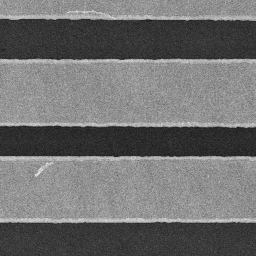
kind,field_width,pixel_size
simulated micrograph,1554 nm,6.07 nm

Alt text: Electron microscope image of lines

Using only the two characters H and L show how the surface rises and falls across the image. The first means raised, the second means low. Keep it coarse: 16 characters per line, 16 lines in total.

HHHHHHHHHHHHHHHH
LLLLLLLLLLLLLLLL
LLLLLLLLLLLLLLLL
LLLLLLLLLLLLLLLL
HHHHHHHHHHHHHHHH
HHHHHHHHHHHHHHHH
HHHHHHHHHHHHHHHH
HHHHHHHHHHHHHHHH
LLLLLLLLLLLLLLLL
LLLLLLLLLLLLLLLL
HHHHHHHHHHHHHHHH
HHHHHHHHHHHHHHHH
HHHHHHHHHHHHHHHH
HHHHHHHHHHHHHHHH
LLLLLLLLLLLLLLLL
LLLLLLLLLLLLLLLL